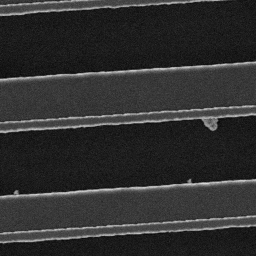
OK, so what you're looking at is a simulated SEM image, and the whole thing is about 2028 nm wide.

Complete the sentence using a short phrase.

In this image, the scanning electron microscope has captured lines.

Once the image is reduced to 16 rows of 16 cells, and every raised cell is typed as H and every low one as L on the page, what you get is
HHHHHHLLLLLLLLLL
LLLLLLLLLLLLLLLL
LLLLLLLLLLLLLLLL
LLLLLLLLLLLLLLLL
LLLLLLLHHHHHHHHH
HHHHHHHHHHHHHHHH
HHHHHHHHHHHHHHHH
HHHHHHHHHHHLLLLL
LLLLLLLLLLLLLLLL
LLLLLLLLLLLLLLLL
LLLLLLLLLLLLLLLL
LLLLLLLLLLLHHHHH
HHHHHHHHHHHHHHHH
HHHHHHHHHHHHHHHH
HHHHHHHHHHLLLLLL
LLLLLLLLLLLLLLLL